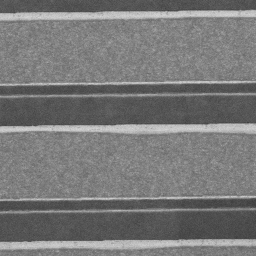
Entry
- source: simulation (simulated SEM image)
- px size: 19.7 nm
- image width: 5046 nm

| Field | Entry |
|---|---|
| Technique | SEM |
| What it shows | lines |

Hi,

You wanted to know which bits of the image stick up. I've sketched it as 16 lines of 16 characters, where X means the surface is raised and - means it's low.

----------------
XXXXXXXXXXXXXXXX
XXXXXXXXXXXXXXXX
XXXXXXXXXXXXXXXX
XXXXXXXXXXXXXXXX
----------------
----------------
----------------
XXXXXXXXXXXXXXXX
XXXXXXXXXXXXXXXX
XXXXXXXXXXXXXXXX
XXXXXXXXXXXXXXXX
X---------------
----------------
----------------
XXXXXXXXXXXXXXXX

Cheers